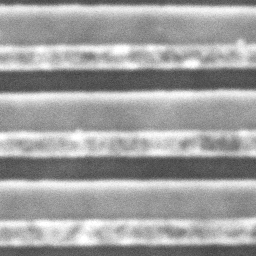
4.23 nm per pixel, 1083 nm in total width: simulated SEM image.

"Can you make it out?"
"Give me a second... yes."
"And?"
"lines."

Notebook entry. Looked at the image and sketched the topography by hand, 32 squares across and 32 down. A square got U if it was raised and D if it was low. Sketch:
DDDDDDDDDDDDDDDDDDDDDDDDDDDDDDDD
UUUUUUUUUUUUUUUUUUUUUUUUUUUUUUUU
UUUUUUUUUUUUUUUUUUUUUUUUUUUUUUUU
UUUUUUUUUUUUUUUUUUUUUUUUUUUUUUUU
UUUUUUUUUUUUUUUUUUUUUUUUUUUUUUUU
UUUUUUUUUUUUUUUUUUUUUUUUUUUUUUUU
UUUUUUUUUUUUUUUUUUUUUUUUUUUUUUUU
UUUUUUUUUUUUUUUUUUUUUUUUUUUUUUUU
UUUUDUUDDDDDDDDDDDDDDDDDDDDDDDDD
DDDDDDDDDDDDDDDDDDDDDDDDDDDDDDDD
DDDDDDDDDDDDDDDDDDDDDDDDDDDDDDDD
DDDDDDDDDDDDDDDDDDDUUUUUDUUUUUUU
UUUUUUUUUUUUUUUUUUUUUUUUUUUUUUUU
UUUUUUUUUUUUUUUUUUUUUUUUUUUUUUUU
UUUUUUUUUUUUUUUUUUUUUUUUUUUUUUUU
UUUUUUUUUUUUUUUUUUUUUUUUUUUUUUUU
UUUUUUUUUUUUUUUUUUUUUUUUUUUUUUUU
UUUUUUUUUUUUUUUUUUUUUUUUUUUUUUUU
UUUUUUUUUUUUUUUUUUUUUUUUUUUUUUUU
DDDDDDDDDDDDDDDDDDDDDDDDDDDDDDDD
DDDDDDDDDDDDDDDDDDDDDDDDDDDDDDDD
DDDDDDDDDDDDDDDDDDDDDDDDDDDDDDDD
DDDDDDDDDDDDDDDDDDDDDDDDDDDDDDDD
UUUUUUUUUUUUUUUUUUUUUUUUUUUUUUUU
UUUUUUUUUUUUUUUUUUUUUUUUUUUUUUUU
UUUUUUUUUUUUUUUUUUUUUUUUUUUUUUUU
UUUUUUUUUUUUUUUUUUUUUUUUUUUUUUUU
UUUUUUUUUUUUUUUUUUUUUUUUUUUUUUUU
UUUUUUUUUUUUUUUUUUUUUUUUUUUUUUUU
UUUUUUUUUUUUUUUUUUUUUUUUUUUUUUUU
DUUDDDDUDDDDDDDDDDDDDDDDDDDDDDDD
DDDDDDDDDDDDDDDDDDDDDDDDDDDDDDDD